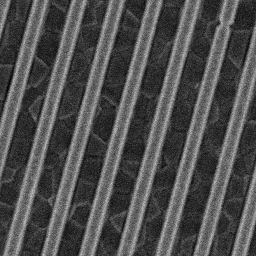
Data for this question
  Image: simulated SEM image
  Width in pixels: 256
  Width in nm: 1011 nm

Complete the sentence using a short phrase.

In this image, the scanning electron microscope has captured parallel lines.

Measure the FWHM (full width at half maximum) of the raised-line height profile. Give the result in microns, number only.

0.0528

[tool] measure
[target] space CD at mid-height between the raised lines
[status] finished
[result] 92.9 nm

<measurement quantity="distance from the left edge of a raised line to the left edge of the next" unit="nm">145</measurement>